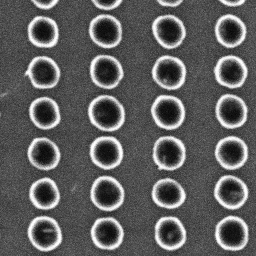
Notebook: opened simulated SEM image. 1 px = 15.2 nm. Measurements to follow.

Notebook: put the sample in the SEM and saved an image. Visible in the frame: a regular array of raised bodies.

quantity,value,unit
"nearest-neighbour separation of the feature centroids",602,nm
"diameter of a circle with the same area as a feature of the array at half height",463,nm